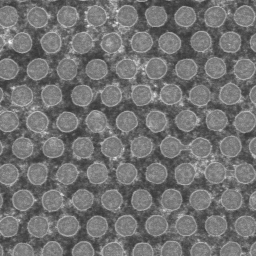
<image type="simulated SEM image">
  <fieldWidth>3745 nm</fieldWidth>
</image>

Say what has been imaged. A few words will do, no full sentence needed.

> a regular array of raised bodies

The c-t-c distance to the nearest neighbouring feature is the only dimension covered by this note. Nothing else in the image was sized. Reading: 426 nm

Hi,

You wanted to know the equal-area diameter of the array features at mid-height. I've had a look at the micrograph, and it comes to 0.305 microns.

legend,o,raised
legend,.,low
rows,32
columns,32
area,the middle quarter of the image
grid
ooo...ooooo..ooooo...oooo...oooo
ooo...ooooo..ooooo..oooooo..oooo
ooo...oooo....oooo...oooo...oooo
oo.....oo.....ooo.....oo.....oo.
................................
....o......oo.....oo......oo....
..ooooo...oooo...ooooo..ooooo...
..ooooo..ooooo...ooooo..ooooo...
..ooooo..ooooo...ooooo..ooooo...
...oooo...oooo....ooo....ooo....
...........o....................
................................
oo....oooo....ooo....oooo....ooo
ooo...ooooo..ooooo...oooo...oooo
ooo...ooooo..ooooo...oooo...oooo
ooo...ooooo..ooooo...oooo...oooo
oo.....ooo....ooo.....ooo.....oo
................................
...........oo.....ooo....ooo....
...oooo...oooo...ooooo...oooo...
..ooooo..ooooo...ooooo..oooooooo
..ooooo..ooooo...ooooo..ooooo..o
...oooo...oooo...oooo....oooo...
................................
................................
ooo....ooo....ooo....oooo....ooo
ooo...ooooo..ooooo...oooo...oooo
ooo...ooooo..ooooo...ooooo..oooo
ooo...ooooo..ooooo...oooo...oooo
oo.....ooo....ooo.....ooo....ooo
................................
...................o......oo....